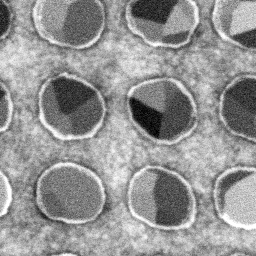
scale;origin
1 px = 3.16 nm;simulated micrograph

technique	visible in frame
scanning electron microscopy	raised bodies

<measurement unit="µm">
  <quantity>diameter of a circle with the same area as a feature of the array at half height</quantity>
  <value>0.203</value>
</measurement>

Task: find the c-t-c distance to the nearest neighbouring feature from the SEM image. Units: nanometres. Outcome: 276